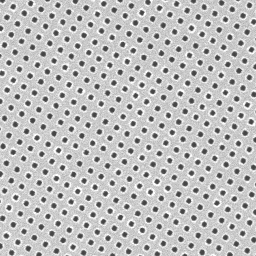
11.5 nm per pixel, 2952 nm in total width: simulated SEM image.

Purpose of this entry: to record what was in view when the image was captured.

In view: a regular array of holes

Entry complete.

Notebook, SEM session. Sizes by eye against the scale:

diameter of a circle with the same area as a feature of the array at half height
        68.8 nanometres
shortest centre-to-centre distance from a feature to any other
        0.139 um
